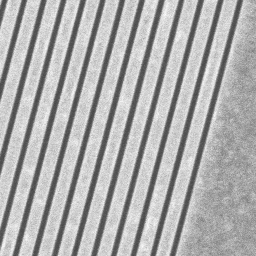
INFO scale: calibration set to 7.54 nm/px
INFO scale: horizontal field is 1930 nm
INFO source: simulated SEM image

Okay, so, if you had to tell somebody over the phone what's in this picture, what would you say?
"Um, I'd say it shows parallel lines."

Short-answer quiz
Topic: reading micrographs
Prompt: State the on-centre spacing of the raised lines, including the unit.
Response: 0.143 microns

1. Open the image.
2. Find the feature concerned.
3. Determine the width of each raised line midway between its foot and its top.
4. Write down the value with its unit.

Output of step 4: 98.4 nm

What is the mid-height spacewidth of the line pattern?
0.0419 µm